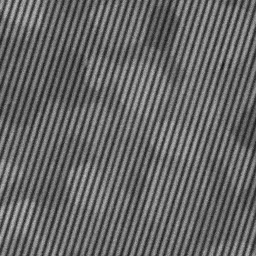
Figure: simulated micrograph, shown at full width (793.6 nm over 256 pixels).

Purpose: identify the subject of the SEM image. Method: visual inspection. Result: parallel lines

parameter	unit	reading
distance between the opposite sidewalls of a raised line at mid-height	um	0.0115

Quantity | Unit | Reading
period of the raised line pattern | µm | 0.0213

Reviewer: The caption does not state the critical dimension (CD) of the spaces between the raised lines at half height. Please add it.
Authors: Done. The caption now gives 3.81 px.